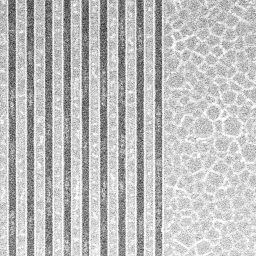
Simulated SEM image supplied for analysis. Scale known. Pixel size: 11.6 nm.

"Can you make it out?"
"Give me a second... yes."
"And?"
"parallel lines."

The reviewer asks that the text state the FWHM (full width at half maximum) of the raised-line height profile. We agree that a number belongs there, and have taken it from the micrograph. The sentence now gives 0.123 um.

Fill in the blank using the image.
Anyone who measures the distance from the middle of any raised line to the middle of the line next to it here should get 212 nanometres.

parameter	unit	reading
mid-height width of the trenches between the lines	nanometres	89.9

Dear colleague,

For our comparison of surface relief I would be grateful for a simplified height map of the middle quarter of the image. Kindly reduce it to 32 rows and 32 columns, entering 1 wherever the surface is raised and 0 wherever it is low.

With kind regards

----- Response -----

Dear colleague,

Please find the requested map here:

00110011100110001100111001111111
00110011100110001100111001111111
00110011100110001100111001111111
00110011100110001100111001111111
00110011100110001100111001111111
00110011100110001100111001111111
00110011100110001100111001111111
00110011100110001100111001111111
00110011100110001100111001111111
00110011100110001100111001111111
00110011100110001100111001111111
00110011100110001100111001111111
00110011100110001100111001111111
00110011100110001100111001111111
00110011100110001100111001111111
00110011100110001100111001111111
00110011100110001100111001111111
00110011100110001100111001111111
00110011100110001100111001111111
00110011100110001100111001111111
00110011100110001100111001111111
00110011100110001100111001111111
00110011100110001100111001111111
00110011100110001100111001111111
00110011100110001100111001111111
00110011100110001100111001111111
00110011100110001100111001111111
00110011100110001100111001111111
00110011100110001100111001111111
00110011100110001100111001111111
00110011100110001100111001111111
00110011100110001100111001111111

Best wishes